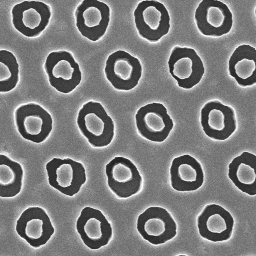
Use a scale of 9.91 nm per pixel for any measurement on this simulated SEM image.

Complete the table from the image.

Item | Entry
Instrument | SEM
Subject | a regular array of ring-shaped grooves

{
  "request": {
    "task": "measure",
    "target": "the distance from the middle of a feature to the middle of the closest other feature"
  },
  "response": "568 nm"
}